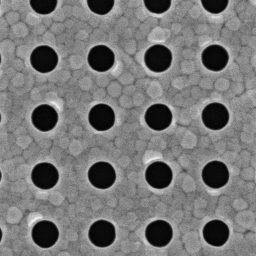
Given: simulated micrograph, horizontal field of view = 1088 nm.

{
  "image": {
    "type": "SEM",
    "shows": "a regular array of holes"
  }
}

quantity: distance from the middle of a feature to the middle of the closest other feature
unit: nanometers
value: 241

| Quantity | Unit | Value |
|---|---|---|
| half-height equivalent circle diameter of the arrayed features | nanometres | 115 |